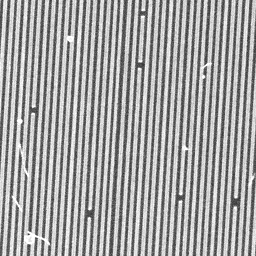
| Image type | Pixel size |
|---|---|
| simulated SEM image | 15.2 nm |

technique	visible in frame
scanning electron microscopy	parallel lines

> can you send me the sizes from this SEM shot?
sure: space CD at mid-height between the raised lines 60.6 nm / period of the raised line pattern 6.9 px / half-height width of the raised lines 49.2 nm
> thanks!